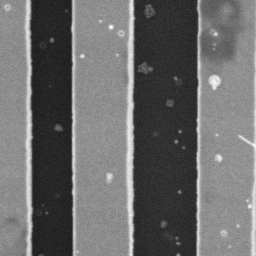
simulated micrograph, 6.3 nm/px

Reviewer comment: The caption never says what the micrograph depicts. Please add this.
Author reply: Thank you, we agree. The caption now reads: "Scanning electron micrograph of lines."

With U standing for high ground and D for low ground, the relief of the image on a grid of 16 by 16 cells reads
UUDDDUUUDDDDUUUU
UUDDUUUUDDDDUUUU
UUDDDUUUDDDDUUUU
UUDDDUUUDDDDUUUU
UUDDDUUUDDDDUUUU
UUDDDUUUDDDDUUUU
UUDDDUUUDDDDUUUU
UUDDDUUUDDDDUUUU
UUDDDUUUDDDDUUUU
UUDDDUUUDDDDUUUU
UUDDDUUUDDDDUUUU
UUDDDUUUDDDDUUUU
UUDDDUUUDDDDUUUU
UUDDDUUUDDDDUUUU
UUDDDUUUDDDDUUUU
UUDDDUUUDDDDUUUU